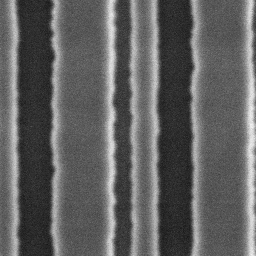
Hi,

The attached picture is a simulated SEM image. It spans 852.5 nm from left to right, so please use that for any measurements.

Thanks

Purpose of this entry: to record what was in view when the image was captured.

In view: lines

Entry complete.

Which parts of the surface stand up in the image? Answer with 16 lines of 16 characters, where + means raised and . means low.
+..+++++++..++++
+..+++++++..++++
+..+++++++..++++
+..+++++++..++++
+..+++++++..++++
+..+++++++..++++
+..+++++++..++++
+..+++++++..++++
+..+++++++..++++
+..+++++++..++++
+..+++++++..++++
+..+++++++..++++
+..+++++++..++++
+..+++++++..++++
+..+++++++..++++
+..+++++++..++++